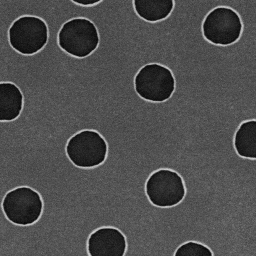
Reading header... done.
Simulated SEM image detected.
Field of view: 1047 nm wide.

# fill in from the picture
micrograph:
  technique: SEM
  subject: holes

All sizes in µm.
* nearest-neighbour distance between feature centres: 0.351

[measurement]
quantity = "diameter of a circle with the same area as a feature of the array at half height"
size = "158 nm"